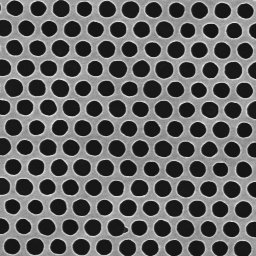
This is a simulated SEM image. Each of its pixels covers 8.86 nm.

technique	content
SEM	a regular array of holes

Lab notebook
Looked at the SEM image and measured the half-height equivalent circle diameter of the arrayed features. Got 143 nm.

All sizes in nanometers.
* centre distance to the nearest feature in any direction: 201